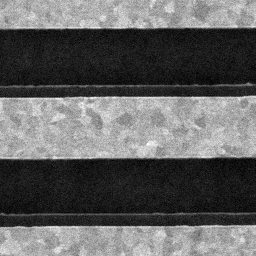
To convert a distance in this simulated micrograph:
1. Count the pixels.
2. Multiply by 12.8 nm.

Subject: lines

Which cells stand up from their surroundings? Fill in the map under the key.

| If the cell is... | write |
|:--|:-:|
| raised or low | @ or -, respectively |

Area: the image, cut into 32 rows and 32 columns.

@@@@@@@@@@@@@@@@@@@@@@@@@@@@@@@@
@@@@@@@@@@@@@@@@@@@@@@@@@@@@@@@@
@@@@@@@@@@@@@@@@@@@@@@@@@@@@@@@@
--------------------------------
--------------------------------
--------------------------------
--------------------------------
--------------------------------
--------------------------------
--------------------------------
-------------------------------@
@@@@@@@@@@@@@@@@@@@@@@@@@@@@@@@@
@@@@@@@@@@@@@@@@@@@@@@@@@@@@@@@@
@@@@@@@@@@@@@@@@@@@@@@@@@@@@@@@@
@@@@@@@@@@@@@@@@@@@@@@@@@@@@@@@@
@@@@@@@@@@@@@@@@@@@@@@@@@@@@@@@@
@@@@@@@@@@@@@@@@@@@@@@@@@@@@@@@@
@@@@@@@@@@@@@@@@@@@@@@@@@@@@@@@@
@@@@@@@@@@@@@@@@@@@@@@@@@@@@@@@@
@@@@@@@@@@@@@@@@@@@@@@@@@@@@@@@@
--------------------------------
--------------------------------
--------------------------------
--------------------------------
--------------------------------
--------------------------------
--------------------------------
@@@@@@@@@@@@@@@@@@@@@@@@@@@@@@@@
@@@@@@@@@@@@@@@@@@@@@@@@@@@@@@@@
@@@@@@@@@@@@@@@@@@@@@@@@@@@@@@@@
@@@@@@@@@@@@@@@@@@@@@@@@@@@@@@@@
@@@@@@@@@@@@@@@@@@@@@@@@@@@@@@@@